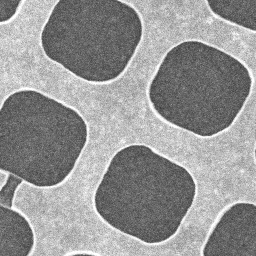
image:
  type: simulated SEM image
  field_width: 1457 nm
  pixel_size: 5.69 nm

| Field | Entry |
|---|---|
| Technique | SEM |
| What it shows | holes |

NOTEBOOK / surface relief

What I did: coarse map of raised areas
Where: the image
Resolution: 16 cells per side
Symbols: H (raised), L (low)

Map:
LHHLLLLLHHHHHLLL
HHHLLLLLLHHHHHHL
HHHLLLLLLHHHHHHH
HHHLLLLLHHLLLLHH
HHHHLLLLHHLLLLLH
HHHHHHHHHLLLLLLL
LLLLHHHHHHLLLLLH
LLLLLHHHHHLLLLLH
LLLLLHHHHHHHHHHH
LLLLLHHLLLHHHHHH
LLLLLHHLLLLHHHHH
LHLLHHLLLLLLHHHH
LHHHHHLLLLLLHHHH
LHHHHHLLLLLLHHLL
LLHHHHHHLLLHHLLL
LLHHHHHHHHHHHLLL